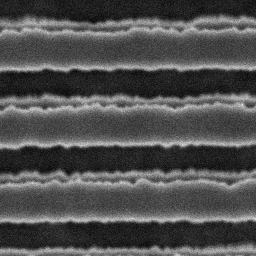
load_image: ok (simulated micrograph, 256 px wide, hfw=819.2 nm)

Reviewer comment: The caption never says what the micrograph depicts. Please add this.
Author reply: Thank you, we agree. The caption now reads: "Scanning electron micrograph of lines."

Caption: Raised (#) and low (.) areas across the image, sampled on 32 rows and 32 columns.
................................
................................
................................
################################
################################
################################
################################
################################
#####################.###...####
................................
................................
................................
.....###.#.#####...###.########.
################################
################################
################################
################################
################################
.#..............................
................................
................................
................................
################################
################################
################################
################################
################################
###########.###.######..###.##..
................................
................................
................................
####.###########################